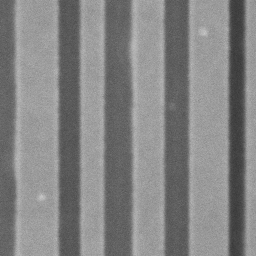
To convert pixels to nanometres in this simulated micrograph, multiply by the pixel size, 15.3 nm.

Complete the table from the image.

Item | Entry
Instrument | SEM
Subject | lines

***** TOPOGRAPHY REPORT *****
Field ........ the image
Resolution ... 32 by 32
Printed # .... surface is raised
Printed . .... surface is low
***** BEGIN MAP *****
..#####...###....###....#####..#
..#####...###....###....#####..#
..#####...###....###....#####..#
..#####...###....###....#####..#
..#####...###....###....#####..#
..#####...###....###....#####..#
..#####...###....###....#####..#
..#####...###....###....#####..#
..#####...###....###....#####..#
..#####...###....###....####...#
..#####...###....###....####...#
..#####...###....###....#####..#
..#####...###....###....####...#
..#####...###....###....####...#
..#####...###....###....#####..#
..#####...###....###....####...#
..#####...###....###....#####..#
..#####...###....###....#####..#
..#####...###....###....#####..#
..#####...###....###....####...#
..#####...###....###....####...#
..#####...###....###....#####..#
..#####...###....###....####...#
..#####...###....###....####...#
..#####...###....###....####...#
..#####...###....###....####...#
..#####...###....###....####...#
..#####...###....###....####...#
..#####...###....###....####...#
..#####...###....###....####...#
..#####...###....###....####...#
..#####...###....###....####...#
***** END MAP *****